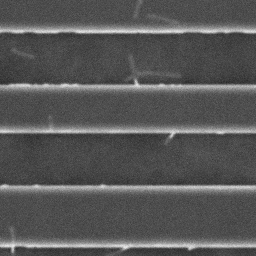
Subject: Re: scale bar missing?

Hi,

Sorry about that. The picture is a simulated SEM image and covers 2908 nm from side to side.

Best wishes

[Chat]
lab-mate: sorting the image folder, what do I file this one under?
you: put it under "lines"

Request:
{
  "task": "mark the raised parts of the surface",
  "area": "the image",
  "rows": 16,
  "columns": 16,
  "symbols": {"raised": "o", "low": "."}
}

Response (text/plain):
oooooooooooooooo
oooooooooooooooo
................
................
................
oooooooooooooooo
oooooooooooooooo
oooooooooooooooo
................
................
................
................
oooooooooooooooo
oooooooooooooooo
oooooooooooooooo
................